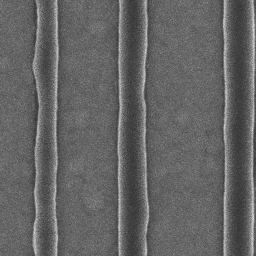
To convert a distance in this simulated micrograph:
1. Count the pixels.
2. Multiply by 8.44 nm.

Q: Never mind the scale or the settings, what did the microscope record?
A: one or a few lines or trenches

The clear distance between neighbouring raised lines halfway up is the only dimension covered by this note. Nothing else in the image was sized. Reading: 593 nm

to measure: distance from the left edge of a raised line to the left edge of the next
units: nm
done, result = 813